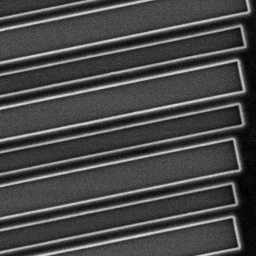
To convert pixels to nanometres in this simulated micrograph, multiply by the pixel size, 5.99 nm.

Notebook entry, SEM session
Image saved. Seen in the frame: parallel lines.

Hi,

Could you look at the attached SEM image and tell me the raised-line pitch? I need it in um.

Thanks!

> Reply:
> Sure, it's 0.226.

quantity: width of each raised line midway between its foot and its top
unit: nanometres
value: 73.4